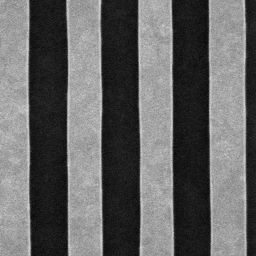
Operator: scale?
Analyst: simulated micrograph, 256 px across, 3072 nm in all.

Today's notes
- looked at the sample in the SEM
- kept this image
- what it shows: wiring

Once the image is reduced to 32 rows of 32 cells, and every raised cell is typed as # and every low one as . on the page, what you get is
####....#####....####.....#####.
####....####.....####.....#####.
####....####.....####.....#####.
####....####.....#####....#####.
####....#####....#####....#####.
####.....####....#####....#####.
####.....####....#####....#####.
###......####....#####....#####.
###......####....#####....#####.
###......####....#####....#####.
###......####....#####....#####.
###.....#####....#####....#####.
###.....#####....#####....#####.
####....#####....#####....#####.
####....#####.....####....#####.
####....#####.....####....#####.
####....#####.....####....#####.
####....#####.....####....#####.
####....#####.....####....#####.
####....#####.....####....#####.
####....#####.....####....#####.
####.....####.....####....#####.
####.....####.....####....#####.
####.....####.....####....#####.
####.....####.....####....#####.
####.....####.....####....#####.
####.....####.....####....#####.
####.....####.....####....#####.
####.....####.....####....#####.
####.....####.....####....#####.
####.....####.....####....#####.
####.....####.....####....#####.